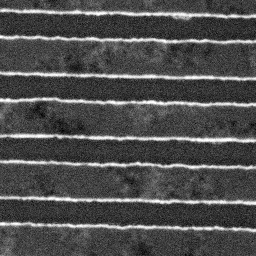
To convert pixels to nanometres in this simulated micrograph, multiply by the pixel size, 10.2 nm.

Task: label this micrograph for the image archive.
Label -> lines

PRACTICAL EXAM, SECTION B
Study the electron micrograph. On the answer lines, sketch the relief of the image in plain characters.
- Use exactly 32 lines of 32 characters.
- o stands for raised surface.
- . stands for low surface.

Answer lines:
oooooooooooooooooooooooooooooooo
......oooooooooooooooooooooooooo
................................
................................
................................
oooooooooooooooooooooooooooooooo
oooooooooooooooooooooooooooooooo
oooooooooooooooooooooooooooooooo
oooooooooooooooooooooooooooooooo
........oooooooooooooooooooooooo
................................
................................
.ooooooo........................
oooooooooooooooooooooooooooooooo
oooooooooooooooooooooooooooooooo
oooooooooooooooooooooooooooooooo
oooooooooooooooooooooooooooooooo
........................oooooooo
................................
................................
ooooooooo........o..............
oooooooooooooooooooooooooooooooo
oooooooooooooooooooooooooooooooo
oooooooooooooooooooooooooooooooo
oooooooooooooooooooooooooooooooo
................................
................................
................................
ooooooooooooooooooooooo.........
oooooooooooooooooooooooooooooooo
oooooooooooooooooooooooooooooooo
oooooooooooooooooooooooooooooooo